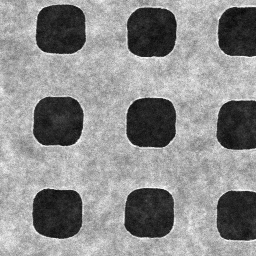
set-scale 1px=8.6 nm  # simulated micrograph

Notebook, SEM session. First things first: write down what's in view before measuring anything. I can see holes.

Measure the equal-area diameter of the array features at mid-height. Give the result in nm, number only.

457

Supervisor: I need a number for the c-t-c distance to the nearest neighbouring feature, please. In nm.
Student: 779